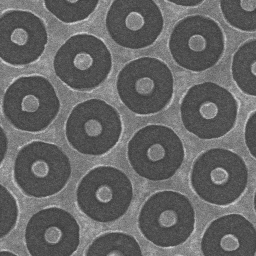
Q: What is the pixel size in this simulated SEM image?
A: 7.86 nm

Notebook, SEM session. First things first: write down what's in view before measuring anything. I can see a regular array of ring-shaped grooves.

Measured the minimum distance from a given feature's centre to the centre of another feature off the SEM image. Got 519 nm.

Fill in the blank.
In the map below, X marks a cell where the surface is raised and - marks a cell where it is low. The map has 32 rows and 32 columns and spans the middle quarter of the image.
---XXXX-----XXX-----------XXX---
----X-------XX-------------XXXXX
-----------XXX-------------XXXXX
-----------XX-------X------XXXXX
---------XXXX-----XXXX-----XXXXX
X-------XXXXX-----XXXX-----XXXXX
XXXXXXXXXXXXX-----XXXX-----XXXX-
XXXXXXXXXXXXXX------X------XXXX-
XXXXXXXXXXXXXX-------------XXX--
XXXXX-----XXXXX-----------XXX---
XXX---------XXXX---------XXXX---
XX-----------XXXX-------XXXXX---
XX------------XXXXX-XXXXXXXXX---
X-------------XXXXXXXXXXXXXXX---
X-----XX------XXXXXXXXXXXXXXXX--
X----XXXX-----XXXXXXX----XXXXX--
-----XXXX-----XXXXX--------XXXX-
------XXX-----XXXX----------XXXX
X-------------XXX------------XXX
X------------XXX-------------XXX
XX----------XXXX------XX------XX
XXX--------XXXXX-----XXXX-----XX
XXXXX-----XXXXXX-----XXXX-----XX
-XXXXXXXXXXXXXXX-----XXXX-----XX
--XXXXXXXXXXXXXX--------------XX
--XXXXXXXXXXXXXXX------------XXX
--XXXXX-------XXXX----------XXXX
--XXXX---------XXXX---------XXXX
-XXXX-----------XXXX------XXXXXX
-XXX-------------XXXXXXXXXXXXXXX
XXX-------X------XXXXXXXXXXXXXXX
XXX-----XXXX-----XXXXXXXXXXXXXXX